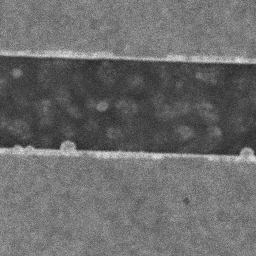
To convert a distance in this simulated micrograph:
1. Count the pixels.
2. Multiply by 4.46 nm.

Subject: one or a few lines or trenches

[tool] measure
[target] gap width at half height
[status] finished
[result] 422 nm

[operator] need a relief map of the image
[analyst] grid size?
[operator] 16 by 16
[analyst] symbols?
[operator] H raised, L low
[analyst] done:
HHHHHHHHHHHHHHHH
HHHHHHHHHHHHHHHH
HHHHHHHHHHHHHHHH
LLLLHHHHHHHHHHHH
LLLLLLLLLLLLLLLL
LLLLLLLLLLLLLLLL
LLLLLLLLLLLLLLLL
LLLLLLLLLLLLLLLL
LLLLLLLLLLLLLLLL
HHHHHLLLLLLLLLLH
HHHHHHHHHHHHHHHH
HHHHHHHHHHHHHHHH
HHHHHHHHHHHHHHHH
HHHHHHHHHHHHHHHH
HHHHHHHHHHHHHHHH
HHHHHHHHHHHHHHHH